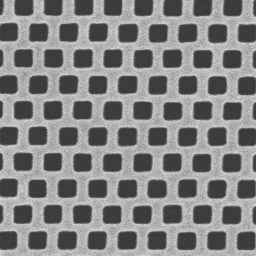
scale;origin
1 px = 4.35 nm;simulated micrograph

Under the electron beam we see a regular array of holes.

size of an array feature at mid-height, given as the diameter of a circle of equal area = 85.8 nm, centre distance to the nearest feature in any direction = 128 nm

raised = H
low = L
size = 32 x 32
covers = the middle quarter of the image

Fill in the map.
HHLLLLLHHHLLLLHHHHLLLLHHHLLLLHHH
HHHHHHHHHHHHHHHHHHHHHHHHHHHHHHHH
HHHHHHHHHHHHHHHHHHHHHHHHHHHHHHHH
LLLHHHLLLLLHHHLLLLHHHHLLLHHHHLLL
LLLHHHLLLLLHHLLLLLHHHLLLLLHHHLLL
LLLHHHLLLLLHHLLLLLHHHLLLLLHHHLLL
LLLHHHLLLLLHHLLLLLHHHLLLLLHHHLLL
HHHHHHHLLLHHHHLLLHHHHHLLLHHHHLLL
HHHHHHHHHHHHHHHHHHHHHHHHHHHHHHHH
HHHLLLLHHHHLLLHHHHLLLLHHHHHHHHHH
HHLLLLLHHHLLLLLHHLLLLLHHHLLLLLHH
HHLLLLLHHHLLLLLHHLLLLLHHHLLLLLHH
HHLLLLLHHHLLLLLHHLLLLLHHHLLLLLHH
HHHLLLLHHHLLLLHHHHLLLLHHHLLLLHHH
HHHHHHHHHHHHHHHHHHHHHHHHHHHHHHHH
HHHHHHHHHHHHHHHHHHHHHHHHHHHHHHHH
LLLHHHLLLLLHHHLLLLHHHLLLLLHHHLLL
LLLHHHLLLLLHHLLLLLHHHLLLLLHHHLLL
LLLHHHLLLLLHHLLLLLHHHLLLLLHHHLLL
LLLHHHLLLLLHHLLLLLHHHLLLLLHHHLLL
HHHHHHHHHHHHHHHLLHHHHHLLLHHHHLLL
HHHHHHHHHHHHHHHHHHHHHHHHHHHHHHHH
HHHLLLHHHHHLLLHHHHLLLHHHHLLLLHHH
HHLLLLLHHHLLLLLHHLLLLLHHHLLLLHHH
HHLLLLLHHHLLLLHHHLLLLLHHHLLLLHHH
HHLLLLLHHHLLLLHHHLLLLLHHHLLLLHHH
HHHLLLLHHHLLLLHHHLLLLLHHHLLLLHHH
HHHHHHHHHHHHHHHHHHHHHHHHHHHHHHHH
HHHHHHHHHHHHHHHHHHHHHHHHHHHHHHHH
LLLHHHLLLLLHHHLLLLHHHLLLLHHHHLLL
LLLHHHLLLLLHHLLLLLHHHLLLLLHHLLLL
LLLHHHLLLLLHHLLLLLHHHLLLLLHHLLLL